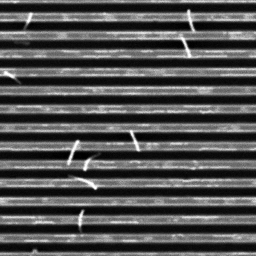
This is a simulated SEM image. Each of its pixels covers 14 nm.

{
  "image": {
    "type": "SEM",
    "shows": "parallel lines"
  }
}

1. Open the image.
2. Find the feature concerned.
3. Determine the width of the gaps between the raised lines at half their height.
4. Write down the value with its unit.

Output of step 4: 137 nm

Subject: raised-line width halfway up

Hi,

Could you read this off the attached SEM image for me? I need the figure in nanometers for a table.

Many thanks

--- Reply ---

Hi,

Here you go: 125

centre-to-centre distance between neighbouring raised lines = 18.4 pixels